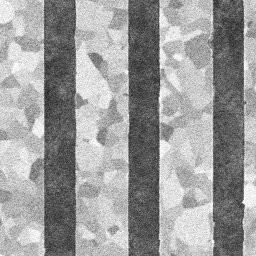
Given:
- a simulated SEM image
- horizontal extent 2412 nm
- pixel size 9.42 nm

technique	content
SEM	one or a few lines or trenches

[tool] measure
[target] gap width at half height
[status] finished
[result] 304 nm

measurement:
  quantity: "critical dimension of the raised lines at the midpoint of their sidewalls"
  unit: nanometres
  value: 495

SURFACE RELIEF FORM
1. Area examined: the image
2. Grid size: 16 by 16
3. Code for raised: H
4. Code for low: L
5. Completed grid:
HHHLLHHHLLHHHLLH
HHHLLHHHLLHHHLLH
HHHLLHHHLLHHHLLH
HHHLLHHHLLHHHLLH
HHHLLHHHLLHHHLLH
HHHLLHHHLLHHHLLH
HHHLLHHHLLHHHLLH
HHHLLHHHLLHHHLLH
HHHLLHHHLLHHHLLH
HHHLLHHHLLHHHLLH
HHHLLHHHLLHHHLLH
HHHLLHHHLLHHHLLH
HHHLLHHHLLHHHLLH
HHHLLHHHLLHHHLLH
HHHLLHHHLLHHHLLH
HHHLLHHHLLHHHLLH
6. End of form